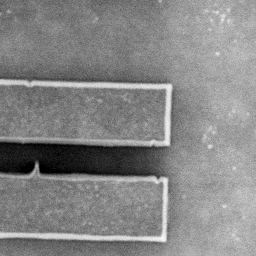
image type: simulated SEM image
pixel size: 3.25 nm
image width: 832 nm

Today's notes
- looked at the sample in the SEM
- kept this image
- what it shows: one or a few lines or trenches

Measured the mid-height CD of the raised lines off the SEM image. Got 0.19 microns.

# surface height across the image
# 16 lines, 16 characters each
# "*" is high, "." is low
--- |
................
................
................
................
................
**********......
***********.....
**********......
**********......
................
................
**********......
**********......
**********......
**********......
................